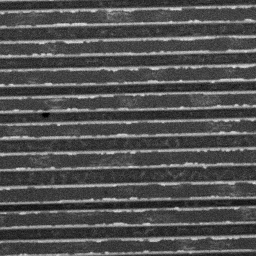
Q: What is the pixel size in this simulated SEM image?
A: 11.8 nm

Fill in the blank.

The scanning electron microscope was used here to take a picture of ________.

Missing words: parallel lines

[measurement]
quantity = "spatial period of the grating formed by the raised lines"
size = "338 nm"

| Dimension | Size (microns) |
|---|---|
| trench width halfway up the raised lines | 0.146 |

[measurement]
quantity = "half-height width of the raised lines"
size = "192 nanometres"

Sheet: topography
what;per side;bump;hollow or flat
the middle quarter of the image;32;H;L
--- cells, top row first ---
LLLLLLLLLLLLLLLLLLLLLLLLLLLLLLLL
HHHHHHHHHHHHHHHHHHHHHHHHHHHHHHHH
HHHHHHHHHHHHHHHHHHHHHHHHHHHHHHHH
HHHHHHHHHHHHHHHHHHHHHHHHHHHHHHHH
HHHHHHHHHHHHHHHHHHHHHHHHHHHHHHHH
LLLLLLLLLLLLLLLLLLLLLLLLLLLLLLLL
LLLLLLLLLLLLLLLLLLLLLLLLLLLLLLLL
LLLLLLLLLLLLLLLLHHHHHHHHHHHHHHHH
HHHHHHHHHHHHHHHHHHHHHHHHHHHHHHHH
HHHHHHHHHHHHHHHHHHHHHHHHHHHHHHHH
HHHHHHHHHHHHHHHHHHHHHHHHHHHHHHHH
HHHHHHHHHLLHHHHHHHHLLLLLLLLLLLLL
LLLLLLLLLLLLLLLLLLLLLLLLLLLLLLLL
LLLLLLLLLLLLLLLLLLLLLLLLLLLLLLLL
LLLLLLLLLLLLLHHHHHHHHHHHHHHHHHHH
HHHHHHHHHHHHHHHHHHHHHHHHHHHHHHHH
HHHHHHHHHHHHHHHHHHHHHHHHHHHHHHHH
HHHHHHHHHHHHHHHHHHHHHHHHHHHHHHHH
LHHHHLLLLLLLLLLLLLLLLLLLLLLLLLLL
LLLLLLLLLLLLLLLLLLLLLLLLLLLLLLLL
LLLLLLLLLLLLLLLLLLLLLLLLLLLLLLLL
LLLLLLLLLLLLLLLLLLLLLLLLLLLLHHHH
HHHHHHHHHHHHHHHHHHHHHHHHHHHHHHHH
HHHHHHHHHHHHHHHHHHHHHHHHHHHHHHHH
HHHHHHHHHHHHHHHHHHHHHHHHHHHHHHHH
HHHHHHHHHHHHHHHHHHHHHHHHHHHHHHHH
LLLLLLLLLLLLLLLLLLLLLLLLLLLLLLLL
LLLLLLLLLLLLLLLLLLLLLLLLLLLLLLLL
LLLLLLLLLLLLLLLLLLLLLLLLLLLLLLLL
LLLLLLLLLLLLLLLLLLLLLLLLLLLLLLLL
LLHHHHHHHHHHHHHHHHHHHHHHHHHHHHHH
HHHHHHHHHHHHHHHHHHHHHHHHHHHHHHHH